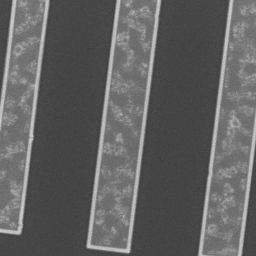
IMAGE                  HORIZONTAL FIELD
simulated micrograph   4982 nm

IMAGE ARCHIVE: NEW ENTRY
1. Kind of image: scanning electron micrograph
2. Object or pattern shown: one or a few lines or trenches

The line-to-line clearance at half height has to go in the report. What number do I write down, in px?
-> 71.6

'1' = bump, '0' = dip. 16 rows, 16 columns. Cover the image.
0110000111000011
0110000111000011
0110000111000011
0110000111000011
1100000110000011
1100000110000011
1100000110000011
1100000110000011
1100001110000111
1100001110000111
1100001110000111
1100001110000111
1000001100000110
1000001100000110
0000001100000110
0000000100000110